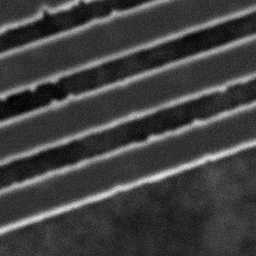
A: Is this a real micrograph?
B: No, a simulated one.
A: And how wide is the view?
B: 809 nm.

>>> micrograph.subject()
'one or a few lines or trenches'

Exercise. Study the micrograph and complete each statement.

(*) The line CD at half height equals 125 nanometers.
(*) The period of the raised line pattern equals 202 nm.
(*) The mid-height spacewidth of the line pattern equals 77.4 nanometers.